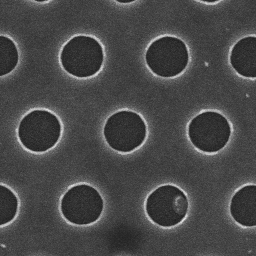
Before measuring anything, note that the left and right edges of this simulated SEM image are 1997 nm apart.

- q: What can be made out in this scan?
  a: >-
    holes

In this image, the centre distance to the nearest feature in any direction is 662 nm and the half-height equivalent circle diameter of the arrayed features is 0.324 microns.